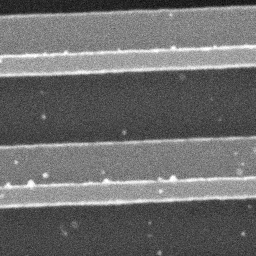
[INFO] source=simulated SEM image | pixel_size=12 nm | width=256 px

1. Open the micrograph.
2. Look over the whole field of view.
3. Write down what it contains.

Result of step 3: lines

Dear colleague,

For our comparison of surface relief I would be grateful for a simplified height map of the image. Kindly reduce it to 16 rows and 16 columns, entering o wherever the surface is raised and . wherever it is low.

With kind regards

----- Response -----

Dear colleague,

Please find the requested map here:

..............oo
oooooooooooooooo
oooooooooooooooo
oooooooooooooooo
ooooooo.........
................
................
................
................
oooooooooooooooo
oooooooooooooooo
oooooooooooooooo
ooooooooooo.....
................
................
................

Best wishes